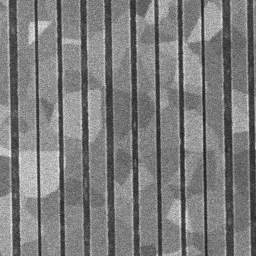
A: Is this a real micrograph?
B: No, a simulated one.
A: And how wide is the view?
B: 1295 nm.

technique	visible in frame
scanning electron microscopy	parallel lines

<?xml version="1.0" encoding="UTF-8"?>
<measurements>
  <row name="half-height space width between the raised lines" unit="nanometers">31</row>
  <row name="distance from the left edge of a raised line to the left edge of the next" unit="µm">0.12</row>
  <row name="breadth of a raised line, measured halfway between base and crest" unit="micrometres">0.091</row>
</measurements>